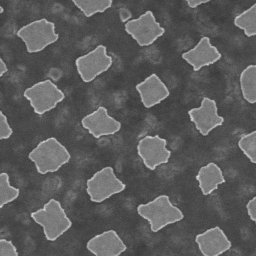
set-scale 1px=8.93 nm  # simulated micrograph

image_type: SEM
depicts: a regular array of raised bodies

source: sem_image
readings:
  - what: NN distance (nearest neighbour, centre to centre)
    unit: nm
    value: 535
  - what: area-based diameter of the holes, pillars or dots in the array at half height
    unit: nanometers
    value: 280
